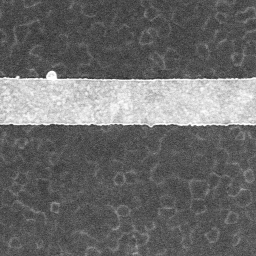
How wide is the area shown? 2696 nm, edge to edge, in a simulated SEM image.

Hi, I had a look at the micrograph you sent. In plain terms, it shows one or a few lines or trenches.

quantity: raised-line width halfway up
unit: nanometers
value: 477